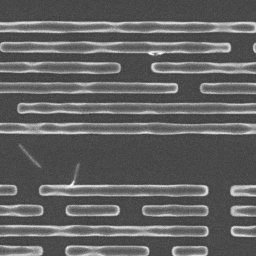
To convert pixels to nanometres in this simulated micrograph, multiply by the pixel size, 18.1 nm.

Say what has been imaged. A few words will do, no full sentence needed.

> groups of lines, slits or small figures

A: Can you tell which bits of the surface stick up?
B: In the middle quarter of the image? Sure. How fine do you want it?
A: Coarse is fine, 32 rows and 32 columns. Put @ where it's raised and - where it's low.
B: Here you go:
@@@@@@@@@@@@@@--------@@@@@@@@@@
@@@@@@@@@@@@@@--------@@@@@@@@@@
--------------------------------
--------------------------------
--------------------------------
@@@@@@@@@@@@@@@@@@@@@@@@@@@@----
@@@@@@@@@@@@@@@@@@@@@@@@@@@@----
--------------------------------
--------------------------------
--------------------------------
@@@@@@@@@@@@@@@@@@@@@@@@@@@@@@@@
@@@@@@@@@@@@@@@@@@@@@@@@@@@@@@@@
--------------------------------
--------------------------------
--------------------------------
@@@@@@@@@@@@@@@@@@@@@@@@@@@@@@@@
@@@@@@@@@@@@@@@@@@@@@@@@@@@@@@@@
--------------------------------
--------------------------------
--------------------------------
--------------------------------
--------------------------------
--------------------------------
--------------------------------
--------------------------------
--------------------------------
--------------------------------
--------------------------------
--------------------------------
--------------------------------
-@@--------@@@@@@--@@@-----@@@@@
@@@@@@@@@@@@@@@@@@@@@@@@@@@@@@@@